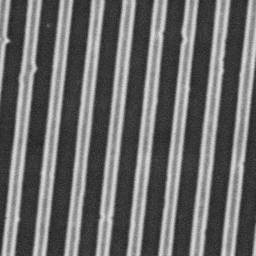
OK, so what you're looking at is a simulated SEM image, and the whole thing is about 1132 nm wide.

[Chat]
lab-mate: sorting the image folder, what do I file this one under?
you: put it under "parallel lines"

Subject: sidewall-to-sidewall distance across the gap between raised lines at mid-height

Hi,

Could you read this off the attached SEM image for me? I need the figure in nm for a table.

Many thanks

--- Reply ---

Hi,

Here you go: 88.5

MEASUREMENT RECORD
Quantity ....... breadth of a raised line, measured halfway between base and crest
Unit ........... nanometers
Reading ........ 48.3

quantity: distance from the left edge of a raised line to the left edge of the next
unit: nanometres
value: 138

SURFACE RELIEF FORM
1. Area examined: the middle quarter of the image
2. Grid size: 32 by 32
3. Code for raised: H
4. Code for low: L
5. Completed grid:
LLLLLHHHLLLLLHHHLLLLLHHHLLLLLHHH
LLLLLHHHLLLLLHHHLLLLLHHHLLLLLHHL
LLLLLHHHLLLLLHHHLLLLLHHHLLLLLHHL
LLLLLHHHLLLLLHHLLLLLLHHHLLLLLHHL
LLLLLHHHLLLLLHHLLLLLLHHLLLLLLHHL
LLLLLHHLLLLLLHHLLLLLHHHLLLLLLHHL
LLLLLHHLLLLLLHHLLLLLHHHLLLLLHHHL
LLLLLHHLLLLLHHHLLLLLHHHLLLLLHHHL
LLLLLHHLLLLLHHHLLLLLHHHLLLLLHHHL
LLLLLHHLLLLLHHHLLLLLHHHLLLLLHHHL
LLLLHHHLLLLLHHHLLLLLHHHLLLLLHHHL
LLLLHHHLLLLLHHHLLLLLHHHLLLLLHHLL
LLLLHHHLLLLLHHHLLLLLHHHLLLLLHHLL
LLLLHHHLLLLLHHLLLLLLHHLLLLLLHHLL
LLLLHHHLLLLLHHLLLLLLHHLLLLLLHHLL
LLLLHHLLLLLLHHLLLLLHHHLLLLLHHHLL
LLLLHHLLLLLLHHLLLLLHHHLLLLLHHHLL
LLLLHHLLLLLHHHLLLLLHHHLLLLLHHHLL
LLLLHHLLLLLHHHLLLLLHHHLLLLLHHHLL
LLLHHHLLLLLHHHLLLLLHHHLLLLLHHHLL
LLLHHHLLLLLHHHLLLLLHHHLLLLLHHLLL
LLLHHHLLLLLHHHLLLLLHHHLLLLLHHLLL
LLLHHHLLLLLHHLLLLLLHHLLLLLLHHLLL
LLLHHHLLLLLHHLLLLLLHHLLLLLLHHLLL
LLLHHLLLLLLHHLLLLLLHHLLLLLHHHLLL
LLLHHLLLLLLHHLLLLLLHHLLLLLHHHLLL
LLLHHLLLLLHHHLLLLLHHHLLLLLHHHLLL
LLLHHLLLLLHHHLLLLLHHHLLLLLHHHLLL
LLLHHLLLLLHHHLLLLLHHHLLLLLHHHLLL
LLLHHLLLLLHHHLLLLLHHHLLLLLHHHLLL
LLHHHLLLLLHHHLLLLLHHHLLLLLHHLLLL
LLHHHLLLLLHHHLLLLLHHLLLLLLHHLLLL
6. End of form